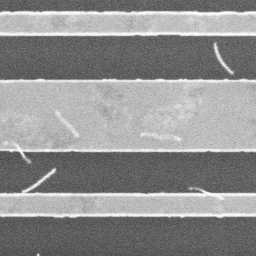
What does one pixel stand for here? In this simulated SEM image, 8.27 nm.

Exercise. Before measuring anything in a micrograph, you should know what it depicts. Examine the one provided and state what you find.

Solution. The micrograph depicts lines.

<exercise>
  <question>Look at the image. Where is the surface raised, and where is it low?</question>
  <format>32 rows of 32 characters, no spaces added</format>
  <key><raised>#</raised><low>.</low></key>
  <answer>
................................
................................
################################
################################
................................
................................
................................
................................
................................
................................
################################
################################
################################
################################
################################
################################
################################
################################
################################
................................
................................
................................
................................
................................
################################
################################
################################
................................
................................
................................
................................
................................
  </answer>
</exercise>